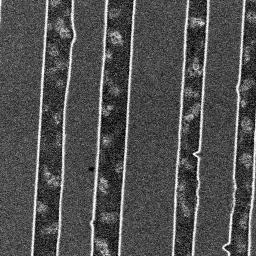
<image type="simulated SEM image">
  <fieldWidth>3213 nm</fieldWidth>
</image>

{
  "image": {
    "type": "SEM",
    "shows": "one or a few lines or trenches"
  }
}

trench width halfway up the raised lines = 313 nm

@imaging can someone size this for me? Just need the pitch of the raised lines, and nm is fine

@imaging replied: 855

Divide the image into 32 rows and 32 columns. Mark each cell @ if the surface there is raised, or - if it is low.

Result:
@@@@@@---@@@@----@@@@@@---@@@@--
@@@@@@---@@@@----@@@@@@---@@@@--
@@@@@@---@@@@----@@@@@@---@@@@--
@@@@@@---@@@@----@@@@@@---@@@@--
@@@@@@---@@@@----@@@@@@---@@@@--
@@@@@@---@@@@----@@@@@@---@@@@--
@@@@@@---@@@@---@@@@@@@---@@@@--
@@@@@----@@@@---@@@@@@@---@@@@--
@@@@@----@@@@---@@@@@@@---@@@@--
@@@@@----@@@@---@@@@@@@---@@@@--
@@@@@----@@@@---@@@@@@@--@@@@@--
@@@@@---@@@@@---@@@@@@@--@@@@@--
@@@@@---@@@@@---@@@@@@@--@@@@@--
@@@@@---@@@@@---@@@@@@@--@@@@@--
@@@@@---@@@@@---@@@@@@@--@@@@@--
@@@@@---@@@@----@@@@@@---@@@@@--
@@@@@---@@@@----@@@@@@---@@@@@--
@@@@@---@@@@----@@@@@@---@@@@---
@@@@@---@@@@----@@@@@@---@@@@---
@@@@@---@@@@----@@@@@@---@@@@---
@@@@@---@@@@----@@@@@@---@@@@---
@@@@@---@@@@----@@@@@@---@@@@---
@@@@@---@@@@---@@@@@@@---@@@@---
@@@@@---@@@@---@@@@@@@---@@@@---
@@@@----@@@@---@@@@@@@---@@@@---
@@@@----@@@@---@@@@@@@---@@@@--@
@@@@----@@@@---@@@@@@@---@@@@--@
@@@@---@@@@@---@@@@@@@--@@@@@--@
@@@@----@@@@---@@@@@@@--@@@@@--@
@@@@---@@@@----@@@@@@@--@@@@@--@
@@@@---@@@@@---@@@@@@@--@@@@---@
@@@@---@@@@----@@@@@@@--@@@@---@